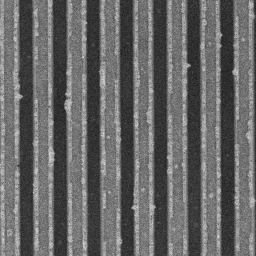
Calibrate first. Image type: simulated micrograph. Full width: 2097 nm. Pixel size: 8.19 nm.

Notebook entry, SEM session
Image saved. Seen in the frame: parallel lines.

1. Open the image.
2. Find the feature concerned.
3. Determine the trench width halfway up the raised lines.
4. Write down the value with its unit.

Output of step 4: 124 nanometres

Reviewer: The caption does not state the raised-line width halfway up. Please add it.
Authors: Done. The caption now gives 145 nm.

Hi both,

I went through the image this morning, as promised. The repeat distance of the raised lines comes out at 274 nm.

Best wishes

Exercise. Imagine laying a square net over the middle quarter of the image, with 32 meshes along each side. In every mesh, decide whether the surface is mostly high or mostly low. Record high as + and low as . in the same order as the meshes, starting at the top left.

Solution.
.++++....+++++....++++....+++++.
.++++....+++++....++++....+++++.
.++++....+++++....++++....+++++.
.++++....+++++....++++....++++..
.++++....+++++....++++....+++++.
.++++....+++++....++++....++++..
.++++.....++++....++++....+++++.
+++++.....++++....++++....+++++.
.++++....+++++....++++....++++..
+++++....+++++....++++....++++..
+++++....+++++....++++....++++..
+++++....+++++....++++....++++..
.++++....+++++....++++....++++..
.++++.....++++....++++....+++++.
.+++++....++++....++++....+++++.
.++++....+++++....++++....++++..
.++++....+++++....++++....++++..
.++++....+++++....++++....++++..
.++++....+++++....++++....++++..
.++++....+++++....++++....++++..
.++++....+++++....++++....++++..
.++++.....++++....++++....++++..
.++++.....++++....++++....++++..
.++++.....++++....++++....++++..
.++++....+++++....++++....++++..
.++++....+++++....++++....++++..
.++++....+++++....++++....++++..
.++++....+++++....++++....++++..
.++++.....++++....++++....++++..
.++++.....++++....++++....++++..
.++++.....++++....++++....++++..
.++++.....++++....++++....++++..